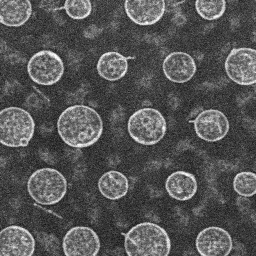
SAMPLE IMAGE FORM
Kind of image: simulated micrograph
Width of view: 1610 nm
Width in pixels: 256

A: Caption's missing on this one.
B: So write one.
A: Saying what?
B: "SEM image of a regular array of raised bodies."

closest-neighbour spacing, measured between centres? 419 nanometres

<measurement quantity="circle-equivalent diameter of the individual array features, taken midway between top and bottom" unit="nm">203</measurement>